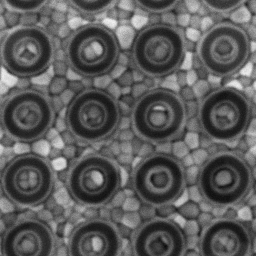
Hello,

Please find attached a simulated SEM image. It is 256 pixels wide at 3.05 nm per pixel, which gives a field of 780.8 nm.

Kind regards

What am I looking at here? a regular array of ring-shaped raised bodies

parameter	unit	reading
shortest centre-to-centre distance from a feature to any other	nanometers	198